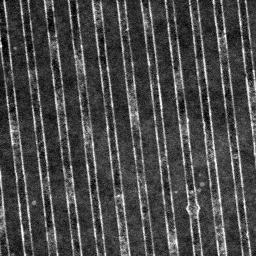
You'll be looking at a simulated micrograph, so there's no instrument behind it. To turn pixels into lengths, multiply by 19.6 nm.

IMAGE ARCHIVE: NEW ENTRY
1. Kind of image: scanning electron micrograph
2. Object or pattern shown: parallel lines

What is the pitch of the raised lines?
472 nanometres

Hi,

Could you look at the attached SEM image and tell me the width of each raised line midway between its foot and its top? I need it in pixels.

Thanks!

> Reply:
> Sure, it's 8.2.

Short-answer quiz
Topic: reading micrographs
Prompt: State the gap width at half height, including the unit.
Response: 15.8 pixels